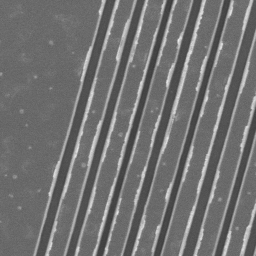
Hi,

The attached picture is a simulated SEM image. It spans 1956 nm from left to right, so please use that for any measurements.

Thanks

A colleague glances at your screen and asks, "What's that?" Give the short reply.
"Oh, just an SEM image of parallel lines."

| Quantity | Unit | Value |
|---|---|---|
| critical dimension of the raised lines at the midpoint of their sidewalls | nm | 150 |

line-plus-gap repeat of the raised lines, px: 28.3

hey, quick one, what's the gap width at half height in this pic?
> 0.0719 um